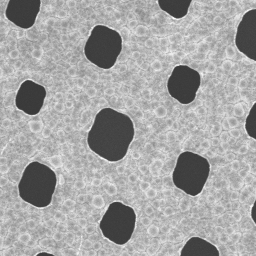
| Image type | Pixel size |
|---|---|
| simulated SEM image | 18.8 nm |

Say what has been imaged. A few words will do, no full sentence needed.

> holes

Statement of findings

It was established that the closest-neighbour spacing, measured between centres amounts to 1.66 microns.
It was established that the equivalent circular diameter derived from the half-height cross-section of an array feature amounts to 738 nanometres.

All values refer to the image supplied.